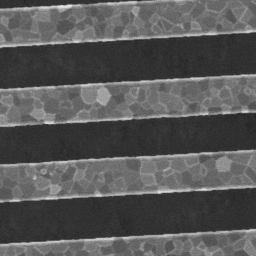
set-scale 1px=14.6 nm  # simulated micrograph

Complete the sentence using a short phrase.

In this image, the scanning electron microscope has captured lines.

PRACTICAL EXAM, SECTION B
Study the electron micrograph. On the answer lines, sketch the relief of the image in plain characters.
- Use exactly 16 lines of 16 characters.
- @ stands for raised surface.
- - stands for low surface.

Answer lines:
---@@@@@@@@@@@@@
@@@@@@@@@@@@@@@@
@@@@@@@---------
----------------
----------------
--@@@@@@@@@@@@@@
@@@@@@@@@@@@@@@@
@@@@@@@---------
----------------
--------------@@
@@@@@@@@@@@@@@@@
@@@@@@@@@@@@@@@@
@@--------------
----------------
--------------@@
@@@@@@@@@@@@@@@@